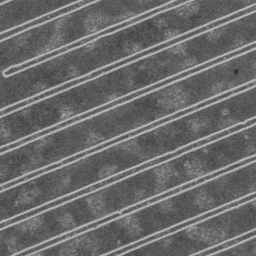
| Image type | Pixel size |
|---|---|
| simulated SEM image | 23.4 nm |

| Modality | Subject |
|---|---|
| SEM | parallel lines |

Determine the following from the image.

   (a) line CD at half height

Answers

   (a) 132 nm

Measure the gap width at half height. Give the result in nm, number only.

680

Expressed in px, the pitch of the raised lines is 34.7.